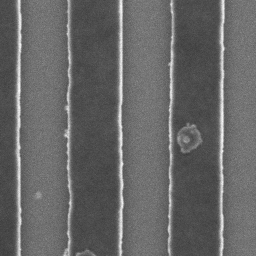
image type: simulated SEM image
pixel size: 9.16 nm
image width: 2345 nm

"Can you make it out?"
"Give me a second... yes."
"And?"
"lines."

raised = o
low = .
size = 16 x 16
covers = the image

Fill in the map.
o...oooo...ooo..
o...oooo...ooo..
o...oooo...ooo..
o...oooo...ooo..
o...oooo...ooo..
o...oooo...ooo..
o...oooo...ooo..
o...oooo...ooo..
o...oooo...ooo..
o...oooo...ooo..
o...oooo...ooo..
o...oooo...ooo..
o...oooo...ooo..
o...oooo...ooo..
o...oooo...ooo..
o...oooo...ooo..